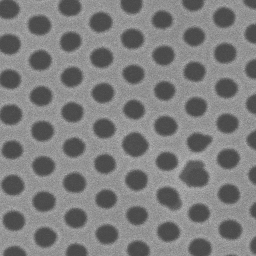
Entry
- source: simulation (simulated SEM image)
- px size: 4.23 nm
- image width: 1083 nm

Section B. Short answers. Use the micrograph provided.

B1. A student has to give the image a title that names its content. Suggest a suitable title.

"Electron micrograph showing a regular array of holes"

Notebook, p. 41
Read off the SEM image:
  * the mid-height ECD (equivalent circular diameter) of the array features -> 91.7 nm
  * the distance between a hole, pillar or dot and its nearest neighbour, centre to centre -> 149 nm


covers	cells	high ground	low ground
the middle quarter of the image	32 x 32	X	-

XXXXXXXX---XXXXX---XXXXXXXXXXX--
----XXXXXXXXXXX-----XXXXXXXXXX--
-----XXXXXXXXXX-----XXXXXXXXXX--
-----XXXXXXXXXX-----XXXXXXXXXX--
----XXXXXXXXXXXX---XXXXX--XXXXXX
X--XXXXX----XXXXXXXXXXX----XXXXX
XXXXXXX------XXXXXXXXX------XXXX
XXXXXXX------XXXXXXXXXX-----XXXX
XXXXXXX-----XXXXXXXXXXX----XXXXX
X--XXXXX---XXXXX---XXXXXXXXXXXX-
----XXXXXXXXXXX-----XXXXXXXXXX--
-----XXXXXXXXXX-----XXXXXXXXXX--
-----XXXXXXXXXX-----XXXXXXXXXXX-
-----XXXXXXXXXXX---XXXXX---XXXXX
X--XXXXX----XXXXXXXXXXX-----XXXX
XXXXXXX------XXXXXXXXX-------XXX
XXXXXXX------XXXXXXXXXX-----XXXX
XXXXXXXX----XXXX---XXXXX---XXXXX
XX-XXXXXX--XXXX-----XXXXXXXXXXX-
-----XXXXXXXXXX------XXXXXXXXXX-
-----XXXXXXXXX-------XXXXXXXXXX-
-----XXXXXXXXXX------XXXXXXXXXX-
----XXXXXX-XXXXX----XXXX---XXXXX
XXXXXXXX----XXXXXXXXXXX-----XXXX
XXXXXXX------XXXXXXXXXX------XX-
XXXXXXX------XXXXXXXXXX-----XX--
XXXXXXXX-----XXXX--XXXXX---XXX--
X---XXXXX--XXXXX----XXXXXXXXX---
-----XXXXXXXXXX------XXXXXXXX---
------XXXXXXXXX------XXXXXXXXX--
------XXXXXXXXXX-----XXXXXXXXXX-
X----XXXXX--XXXXX--XXXXX----XXXX